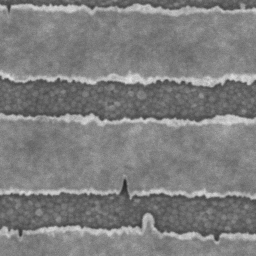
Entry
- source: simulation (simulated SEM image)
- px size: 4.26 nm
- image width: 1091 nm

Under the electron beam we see one or a few lines or trenches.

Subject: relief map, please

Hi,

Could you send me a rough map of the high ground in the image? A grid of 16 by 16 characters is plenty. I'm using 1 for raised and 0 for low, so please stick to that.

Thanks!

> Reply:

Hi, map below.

1100000010000000
1111111111111111
1111111111111111
1111111111111111
1111111111111111
0000000000000000
0000000000000000
1111110000000011
1111111111111111
1111111111111111
1111111111111111
1111111111111111
0000000000000000
0000000000000000
1011111111000000
1111111111111111